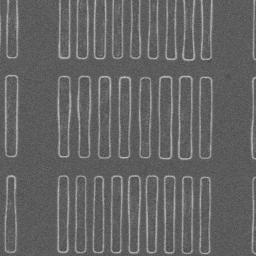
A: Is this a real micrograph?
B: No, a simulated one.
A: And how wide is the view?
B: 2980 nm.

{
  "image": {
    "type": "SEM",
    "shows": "groups of lines, slits or small figures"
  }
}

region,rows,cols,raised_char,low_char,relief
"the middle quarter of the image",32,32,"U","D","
UUUUUUUUUUUUUUUUUUUUUUUUUUUUUUUU
UUUUUUUUUUUUUUUUUUUUUUUUUUUUUUUU
UUUUUUUUUUUUUUUUUUUUUUUUUUUUUUUU
DUUUDDUUUDDUUUUDUUUUDUUUDDDUUDDD
DUUUDDDUUDDDUUDDDUUDDDUUDDDUUDDD
DUUUDDDUUDDDUUDDDUUDDDUUDDDUUDDD
DUUUDDDUUDDDUUDDDUUDDDUUDDDUUDDD
DUUUDDDUUDDDUUDDDUUDDDUUDDDUUDDD
DDUUDDDUUDDUUUDDDUUDDDUUDDDUUDDD
DDUDDDDUUDDUUUDDDUUDDDUUDDDUUDDD
DDUDDDDUUDDUUUDDDUUDDDUUDDDUUDDD
DDUUDDDUUDDUUUDDDUUDDDUUDDDUUDDD
DUUUDDDUUDDUUUDDDUUDDDUUDDDUUDDD
DUUUDDUUUDDUUUDDDUUDDDUUDDDUUDDD
DUUUDDUUUDDUUUDDUUUDDDUUDDDUUDDD
DUUUDDUUUDDUUUDDUUUDDDUUDDDUUDDD
DUUUDDUUUDDUUUDDUUUDDDUUDDDUUDDD
DUUUDDUUUDDUUUDDUUUDDDUUDDDUUDDD
DUUUDDUUUDDUUUDDUUUDDDUUDDDUUDDD
DUUUDDUUUDDUUUDDUUUDDDUUDDDUUDDD
DUUUDDUUUDDUUUDDUUUDDDUUDDDUUDDD
DUUUDDUUUDDUUUDDUUUDDDUUDDDUUDDD
DUUUDDUUUDDUUUDDUUUDDDUUDDDUUDDD
UUUUUUUUUUUUUUUUUUUUUUUUUDUUUDDU
UUUUUUUUUUUUUUUUUUUUUUUUUUUUUUUU
UUUUUUUUUUUUUUUUUUUUUUUUUUUUUUUU
UUUUUUUUUUUUUUUUUUUUUUUUUUUUUUUU
UUUUUUUUUUUUUUUUUUUUUUUUUUUUUUUU
DUUDDUUUDUUUDDUUUDDUUDDUUDDUUUDD
DUUDDDUUDDUUDDDUDDDUUDDUUDDDUUDD
DUUDDDUUDDUUDDDUDDDUDDDUUDDDUUDD
DUUDDDUUDDUUDDDUDDDUDDDUUDDDUUDD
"